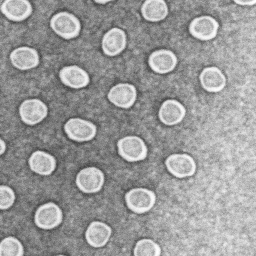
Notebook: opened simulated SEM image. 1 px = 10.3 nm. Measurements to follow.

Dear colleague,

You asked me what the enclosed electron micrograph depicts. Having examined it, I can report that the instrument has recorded a regular array of raised bodies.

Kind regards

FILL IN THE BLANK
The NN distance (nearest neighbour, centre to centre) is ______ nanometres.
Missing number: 530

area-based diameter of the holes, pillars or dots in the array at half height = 248 nm